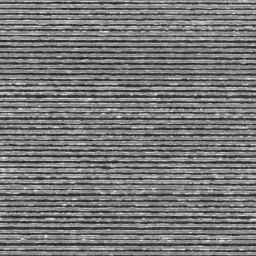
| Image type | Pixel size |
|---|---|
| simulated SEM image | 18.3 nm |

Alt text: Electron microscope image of parallel lines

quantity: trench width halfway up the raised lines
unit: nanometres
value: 50.4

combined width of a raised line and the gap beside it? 5.49 pixels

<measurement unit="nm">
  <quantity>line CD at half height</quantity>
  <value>50.4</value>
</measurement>